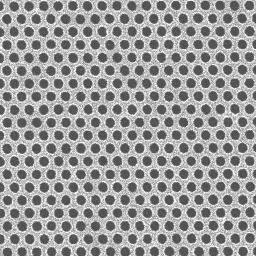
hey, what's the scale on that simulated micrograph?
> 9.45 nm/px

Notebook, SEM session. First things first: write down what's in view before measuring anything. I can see a regular array of holes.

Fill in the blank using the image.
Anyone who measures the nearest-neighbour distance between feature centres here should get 136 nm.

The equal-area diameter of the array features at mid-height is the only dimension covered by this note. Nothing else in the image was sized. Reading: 93 nanometres